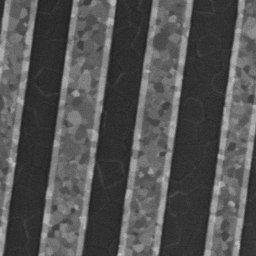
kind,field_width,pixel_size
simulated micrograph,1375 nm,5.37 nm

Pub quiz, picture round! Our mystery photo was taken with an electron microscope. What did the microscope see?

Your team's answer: one or a few lines or trenches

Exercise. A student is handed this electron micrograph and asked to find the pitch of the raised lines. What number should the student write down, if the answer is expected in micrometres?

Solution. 0.42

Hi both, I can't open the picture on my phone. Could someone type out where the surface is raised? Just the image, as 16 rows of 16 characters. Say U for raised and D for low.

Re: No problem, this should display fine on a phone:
UUDDDUUDDDUUDDDU
UUDDDUUDDDUUDDDU
UUDDUUUDDUUUDDDU
UUDDUUUDDUUDDDDU
UUDDUUDDDUUDDDDU
UDDDUUDDDUUDDDUU
UDDDUUDDDUUDDDUU
UDDDUUDDDUUDDDUU
UDDDUUDDDUUDDDUU
UDDUUUDDUUUDDDUU
UDDUUUDDUUDDDDUD
UDDUUUDDUUDDDDUD
DDDUUDDDUUDDDUUD
DDDUUDDDUUDDDUUD
DDDUUDDDUUDDDUUD
DDDUUDDDUUDDDUUD